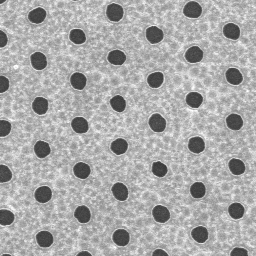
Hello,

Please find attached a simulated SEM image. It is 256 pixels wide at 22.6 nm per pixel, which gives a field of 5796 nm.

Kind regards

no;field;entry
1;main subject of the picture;a regular array of holes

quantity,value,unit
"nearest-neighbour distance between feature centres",995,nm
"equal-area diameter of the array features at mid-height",397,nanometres